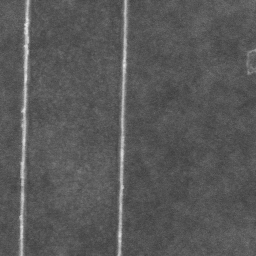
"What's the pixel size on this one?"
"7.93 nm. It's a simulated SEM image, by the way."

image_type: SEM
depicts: one or a few lines or trenches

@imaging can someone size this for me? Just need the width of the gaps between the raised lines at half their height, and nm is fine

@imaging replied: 775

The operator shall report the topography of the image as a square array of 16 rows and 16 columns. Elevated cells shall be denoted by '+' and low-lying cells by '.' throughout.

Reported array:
++......++++++++
++......++++++++
++......++++++++
++......++++++++
++......++++++++
++......++++++++
++......++++++++
++......++++++++
++......++++++++
+.......++++++++
+.......++++++++
+.......++++++++
+.......++++++++
+.......++++++++
+......+++++++++
+......+++++++++